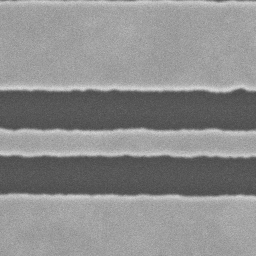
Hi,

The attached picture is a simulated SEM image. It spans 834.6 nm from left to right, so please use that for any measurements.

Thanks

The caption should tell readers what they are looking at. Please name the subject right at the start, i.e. lines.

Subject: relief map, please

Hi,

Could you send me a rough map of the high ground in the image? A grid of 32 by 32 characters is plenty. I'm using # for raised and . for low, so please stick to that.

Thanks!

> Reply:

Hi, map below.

################################
################################
################################
################################
################################
################################
################################
################################
################################
################################
################################
...........................#....
................................
................................
................................
................................
################################
################################
################################
...##..##....#...##..####.######
................................
................................
................................
................................
###############..##.##.......##.
################################
################################
################################
################################
################################
################################
################################